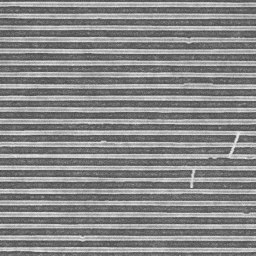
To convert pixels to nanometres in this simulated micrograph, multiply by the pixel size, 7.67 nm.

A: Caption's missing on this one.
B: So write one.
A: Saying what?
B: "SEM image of parallel lines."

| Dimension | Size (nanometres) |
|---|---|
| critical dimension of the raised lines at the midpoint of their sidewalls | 23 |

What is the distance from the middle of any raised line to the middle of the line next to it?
89.6 nanometers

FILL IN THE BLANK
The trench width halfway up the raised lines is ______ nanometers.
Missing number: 61.4